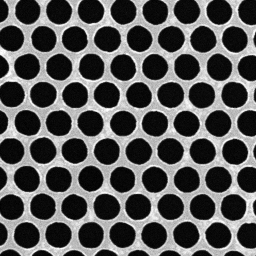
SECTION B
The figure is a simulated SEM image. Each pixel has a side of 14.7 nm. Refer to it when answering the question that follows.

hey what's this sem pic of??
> a regular array of holes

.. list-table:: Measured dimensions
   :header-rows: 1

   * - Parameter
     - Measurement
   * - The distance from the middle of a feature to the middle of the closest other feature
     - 463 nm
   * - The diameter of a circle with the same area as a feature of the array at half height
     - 26.5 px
